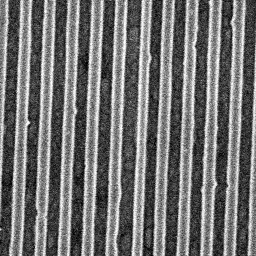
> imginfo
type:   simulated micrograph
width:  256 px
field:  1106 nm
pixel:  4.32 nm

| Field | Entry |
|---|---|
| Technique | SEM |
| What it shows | parallel lines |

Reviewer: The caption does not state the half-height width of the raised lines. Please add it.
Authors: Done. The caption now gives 44.2 nm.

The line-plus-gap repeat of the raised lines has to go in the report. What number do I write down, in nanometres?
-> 102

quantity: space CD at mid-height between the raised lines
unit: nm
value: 56.7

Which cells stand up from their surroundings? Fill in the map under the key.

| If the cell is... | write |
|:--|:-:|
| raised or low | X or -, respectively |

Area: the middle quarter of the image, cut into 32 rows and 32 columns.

-XX---XXX---XXX----XX---XXX---XX
-XX---XXX---XXX----XX---XXX---XX
-XX---XXX---XXX----XX---XXX---XX
-XX---XXX---XXX----XX---XXX---XX
-XX---XXX---XXX----XX---XXX---XX
XXX---XXX---XXX----XX---XXX---XX
XXX---XXX---XXX----XX---XXX---XX
XXX---XX----XXX----XX---XX----XX
XXX---XXX---XXX----XX---XX----XX
XXX---XXX---XX-----XX---XX----XX
XXX---XX----XX-----XX---XX----XX
XXX---XX----XX-----XX---XX----XX
XXX---XX----XX-----XX---XX----XX
XXX---XX----XX-----XX---XX----XX
XX----XX----XX-----XX---XX----XX
XX----XX----XX-----XX---XX----XX
XX----XX----XX-----XX---XX----XX
XX----XX----XX-----X----XX----XX
XX----XX----XX-----X---XXX----XX
XX----XX----XX-----X---XXX----XX
XX----XX----XX----XX---XXX---XXX
XX----XX----XX----XX---XXX---XXX
XX----XX----XX----XX---XXX---XXX
XX----XX----XX----XX---XXX---XXX
XX---XXX----XX----XX---XXX---XXX
XX---XXX----XX----XX---XXX---XXX
XX---XXX---XXX----XX---XXX---XXX
XX---XXX---XXX----XX---XX----XXX
XX---XXX---XXX----XX---XX----XXX
XX---XXX---XXX----XX---XX----XX-
XX---XXX---XXX----XX---XX----XX-
XX---XXX---XXX----XX---XX----XX-